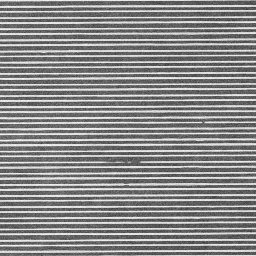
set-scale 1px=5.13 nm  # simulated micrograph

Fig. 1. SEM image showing parallel lines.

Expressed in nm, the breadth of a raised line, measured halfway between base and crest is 9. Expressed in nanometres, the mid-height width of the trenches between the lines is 20.5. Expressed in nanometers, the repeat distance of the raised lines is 28.6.